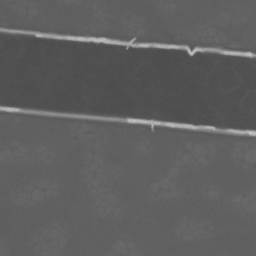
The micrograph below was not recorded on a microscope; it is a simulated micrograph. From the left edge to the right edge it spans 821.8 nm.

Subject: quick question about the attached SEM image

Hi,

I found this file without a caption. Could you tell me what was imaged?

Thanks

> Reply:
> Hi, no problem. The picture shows one or a few lines or trenches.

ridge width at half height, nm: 258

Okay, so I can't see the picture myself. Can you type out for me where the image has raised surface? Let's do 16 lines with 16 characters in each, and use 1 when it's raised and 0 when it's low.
0000000000000000
0000000000000000
1111111000000000
1111111111111111
1111111111111111
1111111111111111
1111111111111111
0000000111111111
0000000000000000
0000000000000000
0000000000000000
0000000000000000
0000000000000000
0000000000000000
0000000000000000
0000000000000000